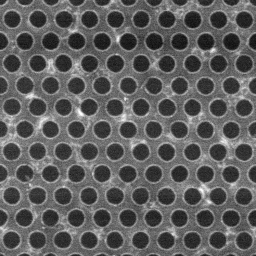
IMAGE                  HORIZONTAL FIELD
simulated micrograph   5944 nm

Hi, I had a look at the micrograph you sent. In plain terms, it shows a regular array of raised bodies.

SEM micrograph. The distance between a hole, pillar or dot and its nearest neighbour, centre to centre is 0.588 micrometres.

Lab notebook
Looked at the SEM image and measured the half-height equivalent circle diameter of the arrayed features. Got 429 nm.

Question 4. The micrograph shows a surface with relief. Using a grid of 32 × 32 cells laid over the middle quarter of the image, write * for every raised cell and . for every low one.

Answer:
**..*****..****..****...****..**
*....***...****...***...***....*
..*.............................
..**....***....**....**.....**..
.****..*****..****..****...****.
.****..*****..****..*****..****.
.****...****..****...***...****.
..**.....**....**.....**....**..
................................
**..****...***...****...***...**
**..****..*****..****...****..**
**..****...****..****...****..**
*....***...****...***...***....*
................................
..**....***....**....**.....**..
.****..*****..****..****...****.
.****..*****..****..*****..****.
.****...****..****..****...****.
........***....**....**.....**..
................................
*...****...****...***...***....*
**..****...****..****..*****..**
**..****...****..****..*****..**
*....***...***....***...***....*
................................
..**....***....**....***....**..
.****...****..****..*****..****.
.****..*****..****..*****..****.
.****...***...****..****...****.
..**.....*.....**....**.....**..
................................
*....***...***...****...***...**